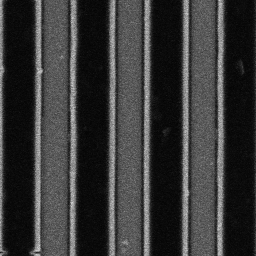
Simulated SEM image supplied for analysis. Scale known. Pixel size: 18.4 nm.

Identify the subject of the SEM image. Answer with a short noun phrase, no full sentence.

one or a few lines or trenches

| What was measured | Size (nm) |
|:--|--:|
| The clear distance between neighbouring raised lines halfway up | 610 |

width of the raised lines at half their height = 741 nanometres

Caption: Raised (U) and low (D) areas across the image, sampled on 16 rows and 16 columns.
UUDDDUUDDUUUDDUU
UUDDDUUDDUUUDDUU
UUDDDUUDDUUUDDUU
UUDDDUUDDUUUDDUU
UUDDDUUDDUUUDDUU
UUDDDUUDDUUUDDUU
UUDDDUUDDUUUDDUU
UUDDDUUDDUUUDDUU
UUDDDUUDDUUUDDUU
UUDDDUUDDUUUDDUU
UUDDDUUDDUUUDDUU
UUDDDUUDDUUUDDUU
UUDDDUUDDUUUDDUU
UUDDDUUDDUUUDDUU
UUDDDUUDDUUUDDUU
UUDDDUUDDUUUDDUU